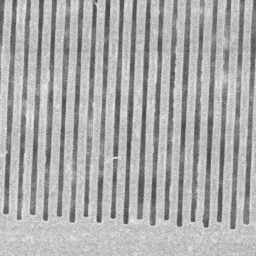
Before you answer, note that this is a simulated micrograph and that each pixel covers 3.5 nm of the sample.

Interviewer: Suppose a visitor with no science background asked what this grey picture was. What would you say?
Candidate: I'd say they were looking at parallel lines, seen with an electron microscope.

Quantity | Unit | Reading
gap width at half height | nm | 18.4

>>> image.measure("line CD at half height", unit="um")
0.0276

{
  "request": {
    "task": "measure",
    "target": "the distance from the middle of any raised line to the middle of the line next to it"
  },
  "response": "46.8 nanometres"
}